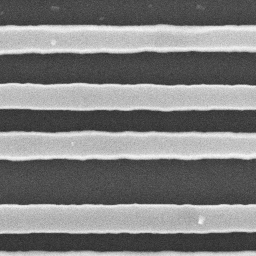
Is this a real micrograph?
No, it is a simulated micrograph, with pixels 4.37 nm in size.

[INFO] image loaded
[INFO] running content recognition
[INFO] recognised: lines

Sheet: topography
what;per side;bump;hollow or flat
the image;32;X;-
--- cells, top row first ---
--------------------------------
--------------------------------
--------------------------------
XXXXXXXXXXXXXXXXXXXXXXXXXXXXXXXX
XXXXXXXXXXXXXXXXXXXXXXXXXXXXXXXX
XXXXXXXXXXXXXXXXXXXXXXXXXXXXXXXX
XXXXXXX--XXX-XXX----------------
--------------------------------
--------------------------------
--------------------------------
XXXX-----XX---------------------
XXXXXXXXXXXXXXXXXXXXXXXXXXXXXXXX
XXXXXXXXXXXXXXXXXXXXXXXXXXXXXXXX
XXXXXXXXXXXXXXXXXXXXXXXXXXXXXXXX
--------------------------------
--------------------------------
-----------X--------------------
XXXXXXXXXXXXXXXXXXXXXXXXXXXXXXXX
XXXXXXXXXXXXXXXXXXXXXXXXXXXXXXXX
XXXXXXXXXXXXXXXXXXXXXXXXXXXXXXXX
--------------------------------
--------------------------------
--------------------------------
--------------------------------
--------------------------------
----------------X---------------
XXXXXXXXXXXXXXXXXXXXXXXXXXXXXXXX
XXXXXXXXXXXXXXXXXXXXXXXXXXXXXXXX
XXXXXXXXXXXXXXXXXXXXXXXXXXXXXXXX
--------------------------------
--------------------------------
----------X-------------------XX